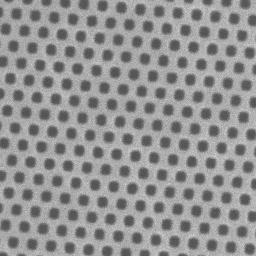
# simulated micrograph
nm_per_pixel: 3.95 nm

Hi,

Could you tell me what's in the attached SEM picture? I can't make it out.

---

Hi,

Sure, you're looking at a regular array of holes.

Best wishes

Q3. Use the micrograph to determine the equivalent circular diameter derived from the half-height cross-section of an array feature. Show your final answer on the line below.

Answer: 0.0478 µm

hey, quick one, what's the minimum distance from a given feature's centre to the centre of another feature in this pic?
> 0.0736 um